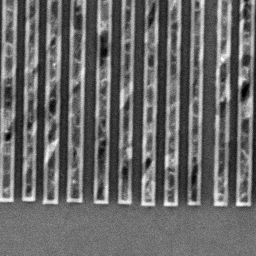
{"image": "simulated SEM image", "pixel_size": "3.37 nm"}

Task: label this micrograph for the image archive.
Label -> parallel lines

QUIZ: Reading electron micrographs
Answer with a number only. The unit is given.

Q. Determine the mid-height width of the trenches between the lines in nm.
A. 40.9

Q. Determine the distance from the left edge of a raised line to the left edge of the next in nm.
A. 80.1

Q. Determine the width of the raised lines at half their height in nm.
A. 37.9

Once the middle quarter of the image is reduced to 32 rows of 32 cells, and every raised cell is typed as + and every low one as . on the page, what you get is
..+++....++....++....++...+++...
..+++....++....++....++...+++...
..+++....++....++....++...+++...
..+++....++....++...+++...+++...
..+++....++....++...+++...++....
..+++....++....++...+++...++....
..+++....++....++...+++...++....
..+++...+++....++...+++...++....
..+++...+++....++...+++...++....
..+++...+++....++...+++...++....
..+++...+++....++...+++...++....
..++....+++...+++...+++...++....
..++....+++...+++...+++...++....
..++....+++...+++...+++...++....
..++....+++...+++...+++...++....
..++....+++...+++...+++...++....
..++....+++...+++...+++...++....
..++....+++...+++...+++...++....
..++....+++...++....+++...++....
..++....+++...++....+++...++....
..++....+++...++....+++...++....
.+++....+++...++....+++...++....
.+++....+++...++....++....++....
.+++....+++...++....++....++....
.+++....+++...++....++....++....
.+++....+++...++....++....++....
.+++....+++...++....++....++....
.+++....+++...++....++....++....
.+++....+++...++....++....++....
.+++....+++...++....++....++...+
.+++....+++...++....++....++...+
.+++....+++...++....++....++...+